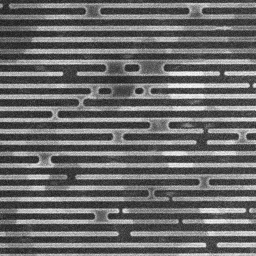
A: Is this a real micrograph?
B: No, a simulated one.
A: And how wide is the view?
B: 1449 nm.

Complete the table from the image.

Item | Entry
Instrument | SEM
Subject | parallel lines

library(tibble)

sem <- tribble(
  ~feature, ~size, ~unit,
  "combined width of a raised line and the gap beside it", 64.6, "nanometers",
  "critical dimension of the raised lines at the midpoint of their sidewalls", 0.0219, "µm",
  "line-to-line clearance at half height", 43.9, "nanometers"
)